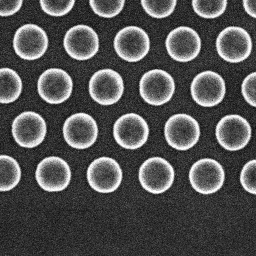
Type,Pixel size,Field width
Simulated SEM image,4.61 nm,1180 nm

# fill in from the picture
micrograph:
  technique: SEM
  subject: a regular array of raised bodies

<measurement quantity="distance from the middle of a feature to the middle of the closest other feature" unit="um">0.232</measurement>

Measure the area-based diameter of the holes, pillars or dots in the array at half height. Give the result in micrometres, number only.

0.158